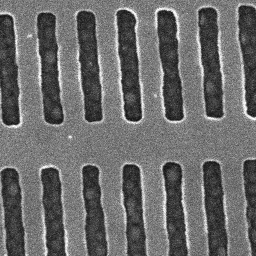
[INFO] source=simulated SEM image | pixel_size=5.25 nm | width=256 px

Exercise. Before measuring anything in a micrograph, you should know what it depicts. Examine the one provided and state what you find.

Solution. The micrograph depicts holes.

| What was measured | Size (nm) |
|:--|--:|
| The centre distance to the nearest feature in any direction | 210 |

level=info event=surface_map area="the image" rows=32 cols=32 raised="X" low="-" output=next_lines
XXXXXXXXXXXXXXXXXXXXXXXXXXXXXXXX
XXXXXXXXXX-XXXX-XXXX-XXXX--XXX--
--XXX--XX---XXX--XXX--XXX--XXX--
--XXX--XXX--XXX--XXX--XXX--XXX--
--XXX--XXX--XXX--XXX--XXX--XXX--
--XXX--XXX--XXX--XXX--XXX--XXX--
--XXX--XXX--XXX--XXX--XXX--XXX--
--XXX--XXX--XXX--XXX--XXX--XXX--
--XXX--XXX--XXX--XXX--XXX---XX--
--XXX--XXX--XXX--XXX---XX---XX--
--XXX--XXX---XX--XXX---XX---XXX-
--XXX---XX---XX---XX---XX---XXX-
--XXX---XX---XX---XX---XX---XXX-
--XXX---XX---XXX--XXX--XXX--XXX-
---XXX--XX---XXX--XXX--XXX--XXX-
X-XXXX-XXXXXXXXXXXXXXXXXXXXXXXXX
XXXXXXXXXXXXXXXXXXXXXXXXXXXXXXXX
XXXXXXXXXXXXXXXXXXXXXXXXXXXXXXXX
XXXXXXXXXXXXXXXXXXXXXXXXXXXXXXXX
XXXXXXXXXXXXXXXXXXXXXXXXXXXXXXXX
XXXXXXXXXXXXXXXXXXXXX-XXX--XXX--
--XXX--XXX--XXX---XX---XX---XX--
--XXX---XX--XXX---XX---XX---XX--
---XX---XX---XX---XXX--XX---XX--
---XX---XX---XX---XXX--XX---XXX-
---XX---XXX--XX---XXX--XXX--XXX-
---XX---XXX--XXX--XXX--XXX--XXX-
---XXX--XXX--XXX--XXX--XXX--XXX-
X--XXX--XXX--XXX--XXX--XXX--XXX-
X--XXX--XXX--XXX--XXX--XXX--XXX-
X--XXX--XXX--XXX--XXX--XXX--XXX-
X--XXX--XXX--XXX--XXX---XX---XX-